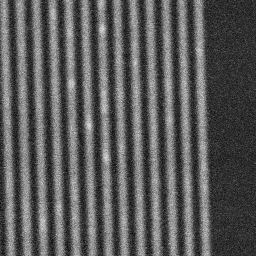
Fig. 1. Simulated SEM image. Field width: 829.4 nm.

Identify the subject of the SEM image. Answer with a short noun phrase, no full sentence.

parallel lines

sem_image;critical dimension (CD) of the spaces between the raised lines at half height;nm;30.8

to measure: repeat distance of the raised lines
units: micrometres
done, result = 0.0526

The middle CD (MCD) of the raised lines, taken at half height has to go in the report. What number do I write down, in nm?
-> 22.3